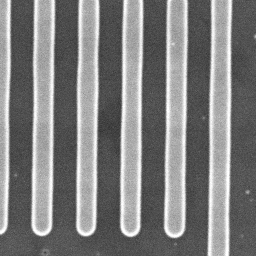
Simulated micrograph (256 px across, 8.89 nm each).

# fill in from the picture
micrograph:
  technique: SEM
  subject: groups of lines, slits or small figures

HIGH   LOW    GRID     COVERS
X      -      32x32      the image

X---XXX---XX----XX---XX---XXX---
X---XXX---XX---XXX---XX---XXX---
X---XXX---XX---XXX---XX---XXX---
X---XXX---XX---XXX---XX----XX---
X---XXX---XX---XXX---XX---XXX---
X---XXX---XX---XXX---XX---XXX---
X---XXX---XX---XXX---XX---XXX---
X---XXX---XX---XXX---XX---XXX---
X---XXX---XX---XXX---XX---XXX---
X---XXX---XX---XXX---XX---XXX---
X---XXX---XX---XXX---XX---XXX---
X---XXX---XX---XXX---XX---XXX---
X---XXX---XX---XXX---XX---XXX---
X---XX----XX---XXX---XX---XXX---
X---XX----XX---XXX---XX---XXX---
X---XX----XX---XXX---XX---XXX---
X---XX----XX---XXX---XX---XXX---
X---XX----XX---XXX---XX---XXX---
X---XX----XX---XXX---XX---XXX---
X---XX----XX---XXX---XX---XXX---
X---XX----XX---XXX---XX---XXX---
X---XX----XX---XXX---XX---XXX---
X---XX----XX---XXX---XX---XXX---
X---XX----XX---XXX---XX---XXX---
X---XX----XX---XXX---XX---XXX---
X---XX----XX---XXX---XX---XXX---
X---XX----XX---XX----XX---XXX---
X---XX----XX---XX----XX---XXX---
X---XX----XX---XX----XX---XXX---
----------------X----X----XXX---
--------------------------XXX---
--------------------------XXX---